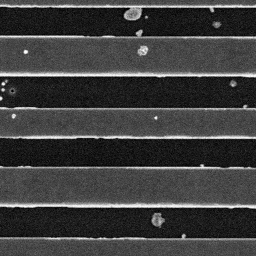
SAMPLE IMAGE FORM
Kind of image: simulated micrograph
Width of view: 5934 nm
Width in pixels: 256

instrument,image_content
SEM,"lines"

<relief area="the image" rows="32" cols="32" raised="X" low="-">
XXXXXXXXXXXXXXXXXXXXXXXXXXXXXXXX
--------------------------------
--------------------------------
--------------------------------
--------------------------------
XXXXXXXXXXXXXXXXXXXXXXXXXXXXXXXX
XXXXXXXXXXXXXXXXXXXXXXXXXXXXXXXX
XXXXXXXXXXXXXXXXXXXXXXXXXXXXXXXX
XXXXXXXXXXXXXXXXXXXXXXXXXXXXXXXX
--------------------------------
--------------------------------
--------------------------------
--------------------------------
X-XXX---------------------------
XXXXXXXXXXXXXXXXXXXXXXXXXXXXXXXX
XXXXXXXXXXXXXXXXXXXXXXXXXXXXXXXX
XXXXXXXXXXXXXXXXXXXXXXXXXXXXXXXX
--------------------------------
--------------------------------
--------------------------------
--------------------------------
XXXXXXXXXXXXXXXXXXXXXXXXXXXXXXXX
XXXXXXXXXXXXXXXXXXXXXXXXXXXXXXXX
XXXXXXXXXXXXXXXXXXXXXXXXXXXXXXXX
XXXXXXXXXXXXXXXXXXXXXXXXXXXXXXXX
XXXXXXXXXXXXXXXXXXXXXXXXXXXXXXXX
--------------------------------
--------------------------------
--------------------------------
--------------------------------
XXXXXXXXXXXXXXXXXXXXXXXXXXXXXXXX
XXXXXXXXXXXXXXXXXXXXXXXXXXXXXXXX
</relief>